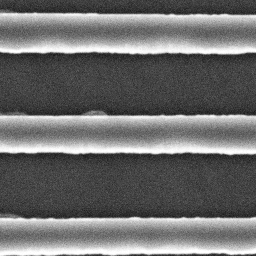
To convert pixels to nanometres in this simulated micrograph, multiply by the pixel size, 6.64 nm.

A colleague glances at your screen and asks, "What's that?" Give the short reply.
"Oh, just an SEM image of lines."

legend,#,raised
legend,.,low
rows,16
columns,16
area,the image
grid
................
################
################
................
................
................
................
################
################
.........#...###
................
................
................
................
################
################